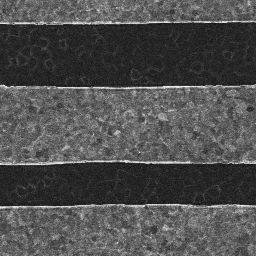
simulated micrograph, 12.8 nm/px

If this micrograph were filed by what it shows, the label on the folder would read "one or a few lines or trenches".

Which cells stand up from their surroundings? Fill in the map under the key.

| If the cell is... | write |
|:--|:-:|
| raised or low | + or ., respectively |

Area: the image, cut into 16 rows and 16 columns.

++++++++++++++++
..++............
................
................
................
++++.+...+++++++
++++++++++++++++
++++++++++++++++
++++++++++++++++
++++++++++++++++
................
................
................
++++++++++++++++
++++++++++++++++
++++++++++++++++